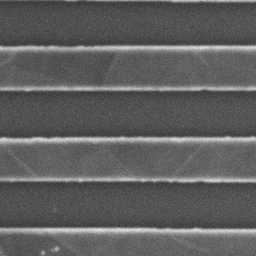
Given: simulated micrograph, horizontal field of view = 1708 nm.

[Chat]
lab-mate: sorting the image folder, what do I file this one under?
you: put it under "lines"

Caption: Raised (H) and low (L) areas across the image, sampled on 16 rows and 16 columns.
LLLLLLLLLLLLLLLL
LLLLLLLLLLLLLLLL
LLLLLLLLLLLLLLLL
HHHHHHHHHHHHHHHH
HHHHHHHHHHHHHHHH
HHHHHHHHHHHHHHHH
LLLLLLLLLLLLLLLL
LLLLLLLLLLLLLLLL
LLLLLLLLLLLLLLLL
HHHHHHHHHHHHHHHH
HHHHHHHHHHHHHHHH
LLLLLLLLLLLLLLLL
LLLLLLLLLLLLLLLL
LLLLLLLLLLLLLLLL
HHHHHHHHHHHHHHHH
HHHHHHHHHHHHHHHH